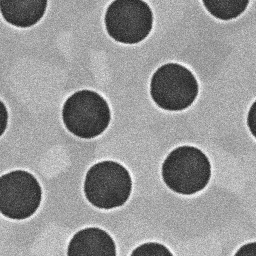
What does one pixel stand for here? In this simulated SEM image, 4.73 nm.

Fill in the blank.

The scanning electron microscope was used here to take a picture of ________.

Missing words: holes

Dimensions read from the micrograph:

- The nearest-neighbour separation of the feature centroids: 365 nm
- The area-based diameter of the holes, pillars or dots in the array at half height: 233 nanometers